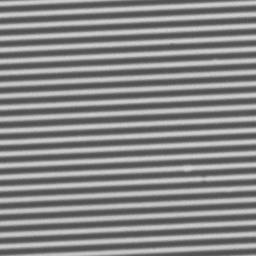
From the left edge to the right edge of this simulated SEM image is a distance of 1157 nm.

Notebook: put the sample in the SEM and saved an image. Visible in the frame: parallel lines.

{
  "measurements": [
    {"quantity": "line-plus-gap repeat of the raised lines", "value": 52.2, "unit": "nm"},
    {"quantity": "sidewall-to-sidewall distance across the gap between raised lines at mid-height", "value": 30.5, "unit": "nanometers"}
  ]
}